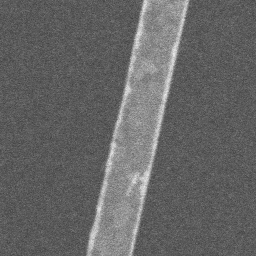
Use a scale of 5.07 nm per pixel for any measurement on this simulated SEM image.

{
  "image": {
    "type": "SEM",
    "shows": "one or a few lines or trenches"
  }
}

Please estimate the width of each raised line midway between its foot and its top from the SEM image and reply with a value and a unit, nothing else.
0.213 µm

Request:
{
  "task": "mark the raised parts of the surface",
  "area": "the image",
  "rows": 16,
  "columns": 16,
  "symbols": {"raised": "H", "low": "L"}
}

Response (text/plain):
LLLLLLLLLHHHLLLL
LLLLLLLLLHHLLLLL
LLLLLLLLHHHLLLLL
LLLLLLLLHHHLLLLL
LLLLLLLLHHHLLLLL
LLLLLLLLHHHLLLLL
LLLLLLLLHHLLLLLL
LLLLLLLHHHLLLLLL
LLLLLLLHHHLLLLLL
LLLLLLLHHHLLLLLL
LLLLLLLHHLLLLLLL
LLLLLLLHHLLLLLLL
LLLLLLHHHLLLLLLL
LLLLLLHHHLLLLLLL
LLLLLLHHHLLLLLLL
LLLLLLHHLLLLLLLL